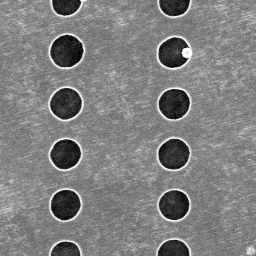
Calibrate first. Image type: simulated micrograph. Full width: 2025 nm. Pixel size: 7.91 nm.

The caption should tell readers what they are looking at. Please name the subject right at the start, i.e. a regular array of holes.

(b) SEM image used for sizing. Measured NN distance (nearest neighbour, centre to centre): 400 nanometers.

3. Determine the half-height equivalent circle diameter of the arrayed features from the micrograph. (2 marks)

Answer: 0.248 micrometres